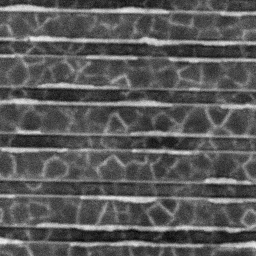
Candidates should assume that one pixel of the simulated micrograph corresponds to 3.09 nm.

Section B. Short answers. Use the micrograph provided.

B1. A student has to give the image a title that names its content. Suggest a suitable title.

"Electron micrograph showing parallel lines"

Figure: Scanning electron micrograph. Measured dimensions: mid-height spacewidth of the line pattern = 42.4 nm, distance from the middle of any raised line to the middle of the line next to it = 0.144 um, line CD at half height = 98.7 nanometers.